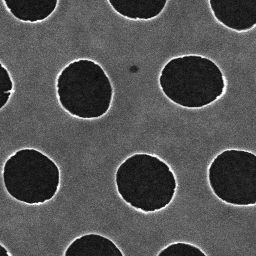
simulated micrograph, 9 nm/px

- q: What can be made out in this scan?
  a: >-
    holes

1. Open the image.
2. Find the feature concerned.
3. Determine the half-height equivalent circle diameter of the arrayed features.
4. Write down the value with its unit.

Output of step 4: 509 nanometers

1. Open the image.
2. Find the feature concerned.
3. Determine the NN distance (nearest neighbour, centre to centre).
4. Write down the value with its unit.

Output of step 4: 944 nanometers